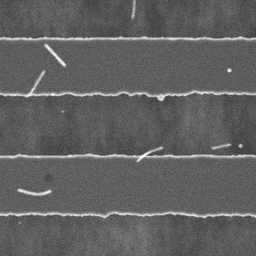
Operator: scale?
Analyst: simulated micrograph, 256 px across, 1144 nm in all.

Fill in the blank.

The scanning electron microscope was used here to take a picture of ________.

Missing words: lines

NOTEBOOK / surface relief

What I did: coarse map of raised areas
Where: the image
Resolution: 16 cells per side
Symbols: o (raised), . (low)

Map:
................
................
oooooooooooooooo
oooooooooooooooo
oooooooooooooooo
oooooooooooooooo
................
................
................
................
oooooooooooooooo
oooooooooooooooo
oooooooooooooooo
......o.....o..o
................
................